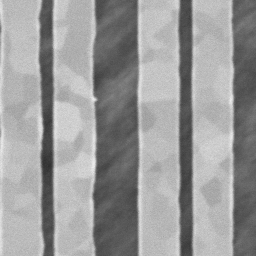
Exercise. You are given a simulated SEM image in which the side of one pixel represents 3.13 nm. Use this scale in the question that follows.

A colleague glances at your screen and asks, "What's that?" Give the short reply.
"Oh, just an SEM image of one or a few lines or trenches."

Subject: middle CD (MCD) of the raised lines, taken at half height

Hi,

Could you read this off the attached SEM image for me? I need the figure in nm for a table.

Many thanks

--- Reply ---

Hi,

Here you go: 122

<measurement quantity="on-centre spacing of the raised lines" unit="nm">210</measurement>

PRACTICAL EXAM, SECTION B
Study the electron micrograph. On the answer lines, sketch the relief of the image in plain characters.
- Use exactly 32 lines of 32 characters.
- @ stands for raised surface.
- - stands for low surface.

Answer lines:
@@@@@--@@@@@-----@@@@@--@@@@@---
@@@@@--@@@@@-----@@@@@--@@@@@---
@@@@@--@@@@@-----@@@@@--@@@@@---
@@@@@--@@@@@-----@@@@@--@@@@@---
@@@@@--@@@@@-----@@@@@--@@@@@---
@@@@@--@@@@@-----@@@@@--@@@@@---
@@@@@--@@@@@-----@@@@@--@@@@@---
@@@@@--@@@@------@@@@@--@@@@@---
@@@@@--@@@@-------@@@@--@@@@@---
@@@@@--@@@@-------@@@@--@@@@@---
@@@@@--@@@@@-----@@@@@--@@@@@---
@@@@@--@@@@@-----@@@@@--@@@@@---
@@@@@--@@@@@-----@@@@@--@@@@@---
@@@@@--@@@@@-----@@@@@--@@@@@---
@@@@@--@@@@@-----@@@@@--@@@@@---
@@@@@--@@@@@-----@@@@@--@@@@@---
@@@@@--@@@@@------@@@@--@@@@@---
@@@@@--@@@@@------@@@@--@@@@@---
@@@@@--@@@@@------@@@@--@@@@@---
@@@@@--@@@@@------@@@@--@@@@@---
@@@@@--@@@@@-----@@@@@--@@@@@---
@@@@@--@@@@@-----@@@@@--@@@@@---
@@@@@--@@@@@-----@@@@@--@@@@@---
@@@@@--@@@@------@@@@@--@@@@@---
@@@@@--@@@@------@@@@@--@@@@@---
@@@@@--@@@@------@@@@@--@@@@@---
@@@@@--@@@@@-----@@@@@--@@@@@---
@@@@@--@@@@@-----@@@@@--@@@@@---
@@@@@--@@@@@-----@@@@@--@@@@@---
@@@@@--@@@@------@@@@@--@@@@@---
@@@@@--@@@@@------@@@@--@@@@@---
@@@@@--@@@@@------@@@@--@@@@@---